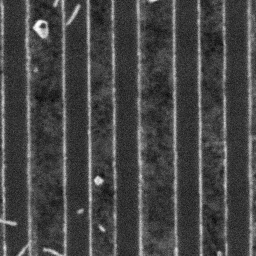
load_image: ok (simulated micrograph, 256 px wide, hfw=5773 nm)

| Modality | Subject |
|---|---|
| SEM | lines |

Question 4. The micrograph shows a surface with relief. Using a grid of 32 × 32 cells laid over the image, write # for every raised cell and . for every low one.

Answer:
...#####...###...#####...###...#
...#####...###...#####...###...#
...#####...###...#####...###...#
...#####...###...#####...###...#
...#####...###...#####...###...#
...#####...###...#####...###...#
...#####...###...#####...###...#
....####...###...#####...###...#
...#####...###...#####...###...#
....####...###...#####...###...#
....####...###...#####...###...#
....####...###...#####...###...#
....####...###...#####...###...#
....####...###...#####...###...#
....####...###...#####...###...#
....####...###...#####...###...#
....####...###...#####...###...#
....####...###...#####...###...#
....####...###...#####...###...#
....####...###....####...###...#
....####...###....####...###...#
....####...###....####...###...#
....####...###....####...###...#
....####...###....####...###...#
....####...###....####...###...#
....####...###....####...###...#
....####...###....####...###...#
#...####...###....####...###...#
....####...###....####...###...#
....####...###....####...###...#
#...####...###....####...###...#
#...####...###....####...###...#